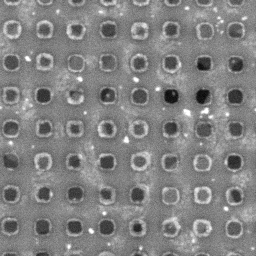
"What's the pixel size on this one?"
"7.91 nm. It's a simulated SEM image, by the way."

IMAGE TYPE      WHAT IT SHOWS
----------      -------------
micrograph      a regular array of raised bodies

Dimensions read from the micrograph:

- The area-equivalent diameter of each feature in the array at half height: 134 nanometres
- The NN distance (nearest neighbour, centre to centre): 250 nm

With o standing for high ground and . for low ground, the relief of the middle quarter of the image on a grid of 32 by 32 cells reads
.oooo....oooo....oooo....oooo...
..oo.............ooo.....ooo....
................................
................................
................................
................................
.ooo.....oooo.....oo.....ooo....
.oooo....oooo....oooo....oooo...
.oooo....oooo....oooo....oooo...
.ooo......oo.....oooo....oooo...
................................
................................
................................
................................
..oo......oo.....ooo............
.oooo....oooo....oooo....oooo...
.oooo....oooo....oooo....oooo...
.oooo....oooo....ooo.....oooo...
...............o................
................................
................................
................................
................................
.oooo....ooo.....oooo....ooo....
.ooo.....ooo.....oooo....ooo....
.ooo.....ooo.....oooo....ooo....
................................
................................
................................
................................
................................
.oooo....ooo.....ooo.....ooo....